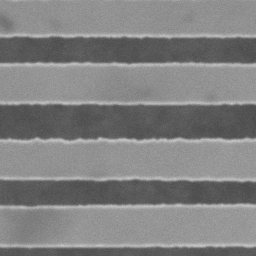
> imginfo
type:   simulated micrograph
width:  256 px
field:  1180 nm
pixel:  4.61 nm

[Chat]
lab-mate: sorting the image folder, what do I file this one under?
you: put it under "lines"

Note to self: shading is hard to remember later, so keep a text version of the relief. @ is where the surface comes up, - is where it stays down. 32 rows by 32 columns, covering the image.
@@@@@@@@@@@@@@@@@@@@@@@@@@@@@@@@
@@@@@@@@@@@@@@@@@@@@@@@@@@@@@@@@
@@@@@@@@@@@@@@@@@@@@@@@@@@@@@@@@
@@@@@@@@@@@@@@@@@@@@@@@@@@@@@@@@
@@-@@@-@@@@@@@@@@@@@@@@@@@@@@@@@
--------------------------------
--------------------------------
--------------------------------
@@@@@@@@@@@@@@@@@@@@@@@@@@@@@@@@
@@@@@@@@@@@@@@@@@@@@@@@@@@@@@@@@
@@@@@@@@@@@@@@@@@@@@@@@@@@@@@@@@
@@@@@@@@@@@@@@@@@@@@@@@@@@@@@@@@
@@@@@@@@@@@@@@@@@@@@@@@@@@@@@@@@
--------------------------------
--------------------------------
--------------------------------
--------------------------------
@@@@@@@@-@@@@@@@@-@@@@@@@@@@@@@@
@@@@@@@@@@@@@@@@@@@@@@@@@@@@@@@@
@@@@@@@@@@@@@@@@@@@@@@@@@@@@@@@@
@@@@@@@@@@@@@@@@@@@@@@@@@@@@@@@@
@@@@@@@@@@@@@@@@@@@@@@@@@@@@@@@@
-----------@@@-@----@@@@@@@@@@@@
--------------------------------
--------------------------------
--------------------------------
@@@@@@@@@@@@@@@@@@@@@@@@@@@@@@@@
@@@@@@@@@@@@@@@@@@@@@@@@@@@@@@@@
@@@@@@@@@@@@@@@@@@@@@@@@@@@@@@@@
@@@@@@@@@@@@@@@@@@@@@@@@@@@@@@@@
@@@@@@@@@@@@@@@@@@@@@@@@@@@@@@@@
--------------------------------